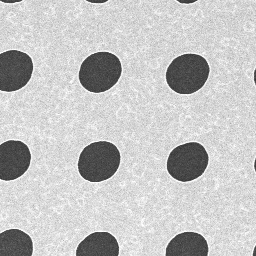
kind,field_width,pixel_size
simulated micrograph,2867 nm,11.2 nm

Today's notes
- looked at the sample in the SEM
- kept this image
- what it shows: holes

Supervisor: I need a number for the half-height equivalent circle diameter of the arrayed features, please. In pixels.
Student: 41.8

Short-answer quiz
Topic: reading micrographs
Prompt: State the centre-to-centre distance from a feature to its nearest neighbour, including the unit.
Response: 985 nm